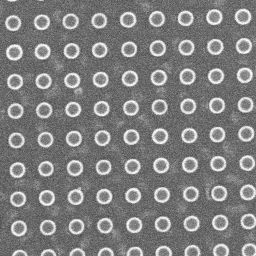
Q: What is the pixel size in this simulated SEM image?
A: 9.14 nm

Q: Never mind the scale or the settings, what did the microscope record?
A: a regular array of raised bodies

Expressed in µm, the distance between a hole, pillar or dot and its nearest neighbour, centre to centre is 0.26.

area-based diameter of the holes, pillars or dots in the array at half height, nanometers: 131